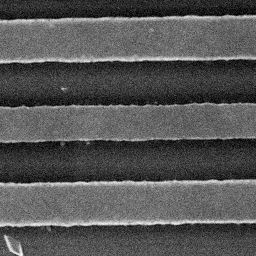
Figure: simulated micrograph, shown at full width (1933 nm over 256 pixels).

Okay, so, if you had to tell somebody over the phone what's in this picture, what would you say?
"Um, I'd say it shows lines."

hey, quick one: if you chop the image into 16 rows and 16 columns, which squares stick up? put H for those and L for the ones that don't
LLLLLLLLLLLLLLLL
HHHHHHHHHHHHHHHH
HHHHHHHHHHHHHHHH
HHHHHHHHHHHHHHHH
LLLLLLLLLLLLLLLL
LLLLLLLLLLLLLLLL
LLLLLLLLLLLLHHHH
HHHHHHHHHHHHHHHH
HHHHHHHHHHHHHHHH
LLLLLLLLLLLLLLLL
LLLLLLLLLLLLLLLL
HLHHHHHHHHHHHHHH
HHHHHHHHHHHHHHHH
HHHHHHHHHHHHHHHH
LLLLLLLLLLLLLLLL
LLLLLLLLLLLLLLLL